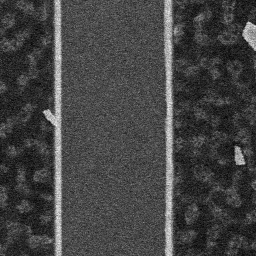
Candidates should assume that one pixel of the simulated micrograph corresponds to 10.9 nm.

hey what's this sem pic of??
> one or a few lines or trenches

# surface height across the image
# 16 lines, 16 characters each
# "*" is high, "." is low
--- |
****.......*****
****.......*****
****.......*****
****.......*****
****.......*****
****.......*****
****.......*****
****.......*****
****.......*****
****.......*****
****.......*****
****.......*****
****.......*****
****.......*****
****.......*****
****.......*****